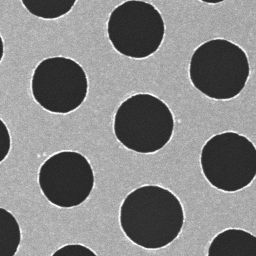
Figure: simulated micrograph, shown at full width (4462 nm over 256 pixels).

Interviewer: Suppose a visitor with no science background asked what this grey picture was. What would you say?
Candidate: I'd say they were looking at holes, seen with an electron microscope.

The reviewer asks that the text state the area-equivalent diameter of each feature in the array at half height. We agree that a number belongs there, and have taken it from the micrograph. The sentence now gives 1030 nm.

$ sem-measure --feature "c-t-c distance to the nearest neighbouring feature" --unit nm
1620